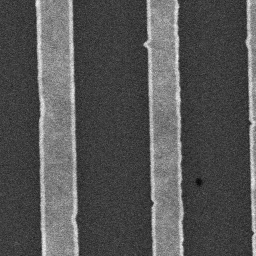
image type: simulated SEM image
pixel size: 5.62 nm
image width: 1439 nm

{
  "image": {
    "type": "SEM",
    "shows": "one or a few lines or trenches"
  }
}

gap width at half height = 411 nanometers